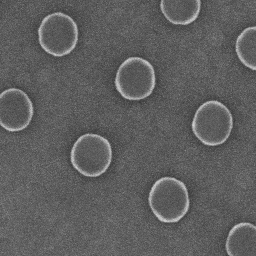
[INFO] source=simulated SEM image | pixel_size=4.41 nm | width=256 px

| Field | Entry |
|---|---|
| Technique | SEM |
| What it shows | raised bodies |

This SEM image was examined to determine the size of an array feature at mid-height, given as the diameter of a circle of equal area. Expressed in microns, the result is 0.178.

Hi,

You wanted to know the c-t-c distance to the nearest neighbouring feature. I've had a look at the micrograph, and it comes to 389 nm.